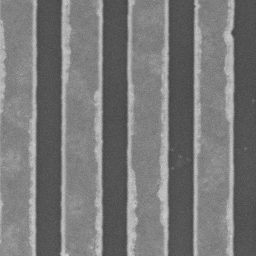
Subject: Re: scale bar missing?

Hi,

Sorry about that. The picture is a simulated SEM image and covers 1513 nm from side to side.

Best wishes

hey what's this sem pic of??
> one or a few lines or trenches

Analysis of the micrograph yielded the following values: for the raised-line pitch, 389 nm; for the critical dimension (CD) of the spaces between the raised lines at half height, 174 nanometers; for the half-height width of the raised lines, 216 nanometers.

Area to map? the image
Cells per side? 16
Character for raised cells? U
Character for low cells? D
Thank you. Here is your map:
UUDDUUDDUUDDUUDD
UUDDUUDDUUDDUUDD
UUDDUUDDUUDDUUDD
UUDDUUDDUUDDUUDD
UUDDUUDDUUDDUUDD
UUDDUUDDUUDDUUDD
UUDDUUDDUUDDUUDD
UUDDUUDDUUDDUUDD
UUDDUUDDUUDDUUDD
UUDDUUDDUUDDUUDD
UUDDUUDDUUDDUUDD
UUDDUUDDUUDDUUDD
UUDDUUDDUUDDUUDD
UUDDUUDDUUDDUUDD
UUDDUUDDUUDDUUDD
UUDDUUDDUUDDUUDD